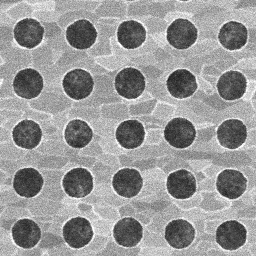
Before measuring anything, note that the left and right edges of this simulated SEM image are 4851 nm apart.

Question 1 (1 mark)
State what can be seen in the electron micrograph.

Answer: a regular array of holes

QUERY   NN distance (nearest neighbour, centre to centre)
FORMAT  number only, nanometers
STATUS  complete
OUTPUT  936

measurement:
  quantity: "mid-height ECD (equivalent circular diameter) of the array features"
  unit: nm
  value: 586